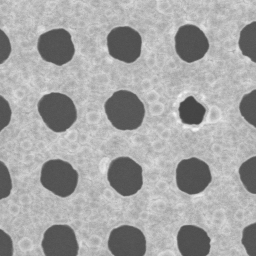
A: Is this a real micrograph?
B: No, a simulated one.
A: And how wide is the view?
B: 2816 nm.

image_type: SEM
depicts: a regular array of holes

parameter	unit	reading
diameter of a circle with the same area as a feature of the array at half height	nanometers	405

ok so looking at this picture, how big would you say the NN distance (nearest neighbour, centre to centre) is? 724 nm